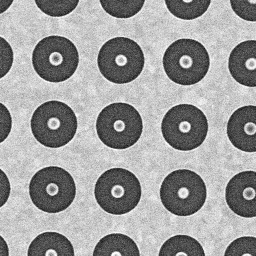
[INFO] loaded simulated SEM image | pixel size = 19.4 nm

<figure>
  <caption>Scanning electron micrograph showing an array of small figures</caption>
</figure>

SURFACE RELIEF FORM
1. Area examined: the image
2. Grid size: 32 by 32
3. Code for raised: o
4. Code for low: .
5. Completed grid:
.ooo......ooo.....ooo.....ooo...
ooooo....oooo....oooo.....ooo...
ooooooooooooooooooooooo.ooooooo.
oooooooooooooooooooooooooooooooo
oooooo..oooooooooooooooooooooooo
.oooo....oooo....oooo....ooooo..
..oo......oo......ooo.....ooo...
..oo..oo..oo...o..oo...o..ooo...
.ooo......oo......oo......ooo...
.oooo....oooo....oooo.....ooo...
oooooooooooooooooooooo..oooooo..
oooooooooooooooooooooooooooooooo
oooooooooooooooooooooooooooooooo
.oooo....oooo....oooo....ooooo..
.ooo.....ooo......ooo.....ooo...
..oo..o...oo......oo......oo...o
.ooo......oo......oo......oo...o
.oooo....oooo....oooo.....ooo...
oooooooooooooo..oooooo..oooooo..
oooooooooooooooooooooooooooooooo
oooooooooooooooooooooooooooooooo
.oooo...ooooo...ooooo...oooooo..
.ooo.....ooo.....ooo.....oooo...
.ooo..o..ooo..o...oo......oo....
.ooo.....ooo..o...oo......oo...o
.ooo.....ooo.....ooo......oo....
oooooo.oooooo...ooooo....oooo...
oooooooooooooooooooooooooooooooo
oooooooooooooooooooooooooooooooo
ooooo...ooooo...oooooo..oooooooo
.ooo.....ooo.....ooo.....oooo...
.oo...o..ooo.....ooo......oo....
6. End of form